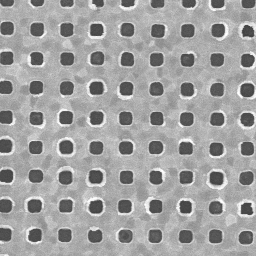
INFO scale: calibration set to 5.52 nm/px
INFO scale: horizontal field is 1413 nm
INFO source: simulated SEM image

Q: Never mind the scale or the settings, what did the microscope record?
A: a regular array of holes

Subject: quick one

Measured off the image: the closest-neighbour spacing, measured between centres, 161 nanometres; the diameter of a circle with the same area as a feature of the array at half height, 81.7 nanometers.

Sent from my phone